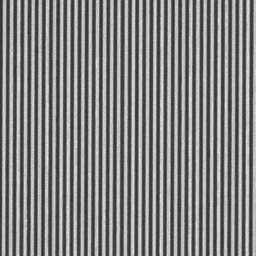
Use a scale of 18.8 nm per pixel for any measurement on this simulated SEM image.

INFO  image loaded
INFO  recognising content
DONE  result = parallel lines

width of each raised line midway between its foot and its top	54.1	nm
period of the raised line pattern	135	nanometers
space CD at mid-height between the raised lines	70.5	nm